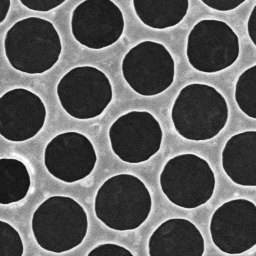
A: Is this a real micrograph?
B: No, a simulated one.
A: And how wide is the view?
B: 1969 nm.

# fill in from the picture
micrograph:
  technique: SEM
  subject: a regular array of holes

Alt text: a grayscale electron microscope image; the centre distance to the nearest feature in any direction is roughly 516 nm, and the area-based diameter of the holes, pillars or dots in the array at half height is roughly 0.415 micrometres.